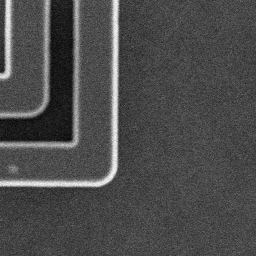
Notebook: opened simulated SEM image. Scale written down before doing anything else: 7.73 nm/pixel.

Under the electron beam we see groups of lines, slits or small figures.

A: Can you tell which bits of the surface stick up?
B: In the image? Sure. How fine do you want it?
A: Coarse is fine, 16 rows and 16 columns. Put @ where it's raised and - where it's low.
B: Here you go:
@@@--@@---------
@@@--@@---------
@@@--@@---------
@@@--@@---------
@@@--@@---------
@@@--@@---------
@@@--@@---------
-----@@---------
-----@@---------
@@@@@@@---------
@@@@@@@---------
@@@@@@----------
----------------
----------------
----------------
----------------